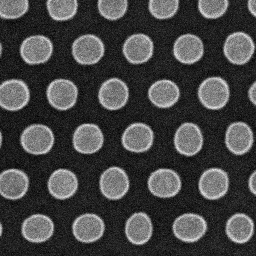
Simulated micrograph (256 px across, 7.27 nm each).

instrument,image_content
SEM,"a regular array of raised bodies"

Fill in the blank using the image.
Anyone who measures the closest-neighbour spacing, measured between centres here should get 365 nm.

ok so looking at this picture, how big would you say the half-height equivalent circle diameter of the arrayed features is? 213 nm